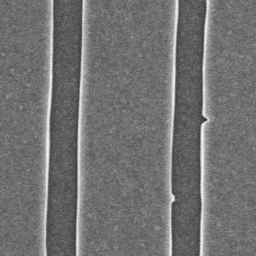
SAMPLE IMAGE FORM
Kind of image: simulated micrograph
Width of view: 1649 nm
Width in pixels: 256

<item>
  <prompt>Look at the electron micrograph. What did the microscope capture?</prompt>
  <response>one or a few lines or trenches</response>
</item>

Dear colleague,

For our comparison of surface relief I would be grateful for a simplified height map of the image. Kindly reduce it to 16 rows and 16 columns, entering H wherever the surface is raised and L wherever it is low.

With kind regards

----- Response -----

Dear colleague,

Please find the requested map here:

HHHLLHHHHHHLLHHH
HHHLLHHHHHHLLHHH
HHHLLHHHHHHLLHHH
HHHLLHHHHHHLLHHH
HHHLLHHHHHHLLHHH
HHHLLHHHHHHLLHHH
HHHLLHHHHHHLLHHH
HHHLLHHHHHHLLHHH
HHHLLHHHHHHLLHHH
HHHLLHHHHHHLLHHH
HHHLLHHHHHHLLHHH
HHHLLHHHHHHLLHHH
HHHLLHHHHHHLLHHH
HHHLLHHHHHHLLHHH
HHHLLHHHHHHLLHHH
HHHLLHHHHHHLLHHH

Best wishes